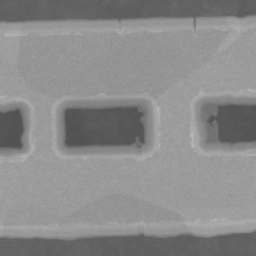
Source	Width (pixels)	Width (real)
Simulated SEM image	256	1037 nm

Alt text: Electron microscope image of one or a few lines or trenches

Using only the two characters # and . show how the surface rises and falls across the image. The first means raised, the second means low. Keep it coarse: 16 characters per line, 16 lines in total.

................
..............##
################
################
################
################
####.....###....
..##......##....
..##......##....
.###.....#######
################
################
################
################
................
................